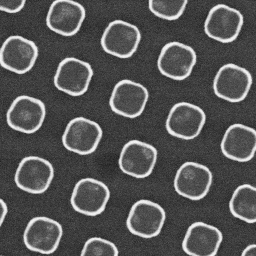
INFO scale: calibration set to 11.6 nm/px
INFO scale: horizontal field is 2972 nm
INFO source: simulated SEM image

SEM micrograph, a regular array of raised bodies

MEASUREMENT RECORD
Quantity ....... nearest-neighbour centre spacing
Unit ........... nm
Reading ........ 695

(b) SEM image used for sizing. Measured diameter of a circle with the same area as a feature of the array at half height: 409 nanometres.